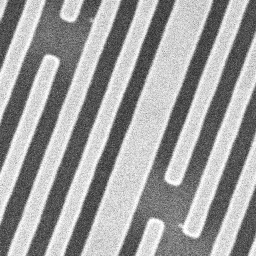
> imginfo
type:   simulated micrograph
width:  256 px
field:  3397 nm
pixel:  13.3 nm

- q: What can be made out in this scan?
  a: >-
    groups of lines, slits or small figures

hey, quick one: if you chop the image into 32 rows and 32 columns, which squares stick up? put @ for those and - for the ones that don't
@--@@---@@---@@--@@@--@@@@---@@-
---@@---@@--@@@--@@--@@@@@--@@--
--@@@---@---@@---@@--@@@@@--@@--
--@@--------@@--@@---@@@@---@@--
--@@-------@@---@@--@@@@@--@@---
-@@@-------@@--@@@--@@@@@--@@--@
-@@-------@@@--@@---@@@@--@@@--@
-@@--@@---@@---@@--@@@@@--@@---@
@@---@@---@@--@@@--@@@@---@@--@@
@@---@@--@@@--@@--@@@@@--@@@--@@
@@--@@---@@---@@--@@@@@--@@---@@
@---@@---@@--@@---@@@@---@@--@@-
@--@@@--@@---@@--@@@@@--@@---@@-
@--@@---@@---@@--@@@@@--@@---@@-
---@@--@@@--@@---@@@@--@@@--@@--
--@@@--@@---@@--@@@@@--@@---@@--
--@@---@@--@@@--@@@@---@@--@@@--
--@@--@@@--@@--@@@@@--@@@--@@---
-@@---@@---@@--@@@@@--@@---@@--@
-@@---@@--@@---@@@@---@@--@@---@
-@@--@@---@@--@@@@@--@@---@@---@
@@---@@---@@--@@@@@--@@---@@--@@
@@--@@@--@@---@@@@---@@--@@---@@
@@--@@---@@--@@@@@-------@@---@@
@---@@--@@@--@@@@@------@@@--@@-
@--@@@--@@---@@@@-------@@---@@-
---@@---@@--@@@@@-------@@--@@@-
---@@--@@@--@@@@---@---@@@--@@--
--@@@--@@---@@@@--@@---@@---@@--
--@@---@@--@@@@@--@@----@--@@---
-@@@--@@---@@@@---@@-------@@---
-@@---@@--@@@@@--@@--------@@--@